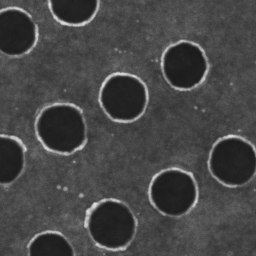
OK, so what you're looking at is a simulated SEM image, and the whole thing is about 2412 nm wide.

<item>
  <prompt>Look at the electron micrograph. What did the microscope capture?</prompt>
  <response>holes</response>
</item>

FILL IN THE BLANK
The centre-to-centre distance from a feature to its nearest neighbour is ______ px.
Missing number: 69.4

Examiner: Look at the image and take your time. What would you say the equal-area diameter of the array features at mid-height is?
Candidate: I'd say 410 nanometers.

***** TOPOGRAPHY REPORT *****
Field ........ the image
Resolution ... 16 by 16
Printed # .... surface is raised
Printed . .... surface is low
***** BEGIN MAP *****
###...##########
..##############
..##############
##########...###
##########...###
#######..#######
######...#######
###..###########
###..###########
.############...
.############...
##########..####
##########..####
######..########
######..########
##..############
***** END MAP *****